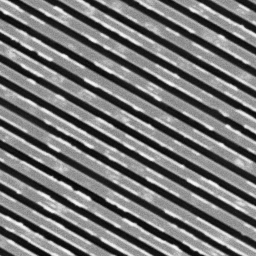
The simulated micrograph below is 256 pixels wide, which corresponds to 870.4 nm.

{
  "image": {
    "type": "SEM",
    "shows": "parallel lines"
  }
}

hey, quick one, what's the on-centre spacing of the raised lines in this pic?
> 63.9 nm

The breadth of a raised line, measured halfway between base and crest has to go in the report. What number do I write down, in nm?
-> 37.5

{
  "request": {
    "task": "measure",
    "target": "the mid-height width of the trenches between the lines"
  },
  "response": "24.1 nm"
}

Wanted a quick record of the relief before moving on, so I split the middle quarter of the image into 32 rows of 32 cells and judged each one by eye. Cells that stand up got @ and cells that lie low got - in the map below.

@@@@@---@@@@@@-----@@@@@----@@@@
-@@@@@----@@@@@@----@@@@@@---@@@
---@@@@@----@@@@@@----@@@@@@---@
-----@@@@@----@@@@@@----@@@@@---
@@----@@@@@@----@@@@@----@@@@@@-
@@@@----@@@@@-----@@@@@----@@@@@
@@@@@@----@@@@@-----@@@@@----@@@
--@@@@@-----@@@@@----@@@@@@----@
----@@@@@----@@@@@@----@@@@@----
@@---@@@@@@----@@@@@@----@@@@@--
@@@@---@@@@@@----@@@@@-----@@@@@
@@@@@----@@@@@----@@@@@@----@@@@
-@@@@@@----@@@@@----@@@@@@----@@
---@@@@@@----@@@@@----@@@@@@----
@----@@@@@@---@@@@@@----@@@@@---
@@@---@@@@@@----@@@@@@----@@@@@-
@@@@----@@@@@@----@@@@@-----@@@@
@@@@@@----@@@@@@----@@@@@----@@@
---@@@@@----@@@@@----@@@@@@----@
@---@@@@@@----@@@@@----@@@@@@---
@@----@@@@@@---@@@@@@----@@@@@--
@@@@----@@@@@----@@@@@@----@@@@@
@@@@@-----@@@@@----@@@@@@----@@@
--@@@@@----@@@@@@----@@@@@@---@@
----@@@@@----@@@@@@---@@@@@@----
@----@@@@@@----@@@@@----@@@@@@--
@@@----@@@@@@----@@@@@----@@@@@@
@@@@@----@@@@@-----@@@@@----@@@@
-@@@@@-----@@@@@----@@@@@@---@@@
---@@@@@@---@@@@@@----@@@@@----@
@----@@@@@----@@@@@@----@@@@@---
@@@---@@@@@@----@@@@@-----@@@@@-